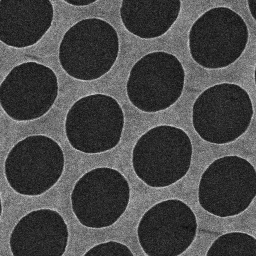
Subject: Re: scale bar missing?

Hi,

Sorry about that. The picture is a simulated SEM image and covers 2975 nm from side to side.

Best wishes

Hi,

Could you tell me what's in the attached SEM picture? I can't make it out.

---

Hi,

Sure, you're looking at a regular array of holes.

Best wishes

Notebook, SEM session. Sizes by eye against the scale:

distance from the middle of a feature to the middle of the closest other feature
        856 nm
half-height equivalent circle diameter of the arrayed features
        0.691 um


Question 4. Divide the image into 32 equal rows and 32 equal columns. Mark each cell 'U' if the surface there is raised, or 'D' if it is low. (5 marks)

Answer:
DDDDDDUUUDDUUUUDDDDDDDDUUUUUUUUD
DDDDDDDUUUUUUUUDDDDDDDUUUUDDDUUD
DDDDDDUUUUDDDUUDDDDDDDUUUDDDDDUU
DDDDDDUUUDDDDDUUDDDDDUUUDDDDDDDU
DDDDDUUUDDDDDDDUUDDDUUUUDDDDDDDU
UDDDUUUUDDDDDDDUUUUUUUUUDDDDDDDU
UUUUUUUDDDDDDDDUUUUUUUUUDDDDDDUU
UUUUUUUDDDDDDDUUUDDDDDUUDDDDDUUU
UUDDDDUUDDDDDDUUUDDDDDDUUUDUUUUU
UDDDDDDUUDDDDUUUDDDDDDDUUUUUUUUU
DDDDDDDUUUUUUUUUDDDDDDDUUUUUDUUU
DDDDDDDUUUUUUUUUDDDDDDDUUDDDDDDU
DDDDDDDUUUDDDDUUDDDDDDUUUDDDDDDU
DDDDDDUUUDDDDDDUUDDDDUUUDDDDDDDD
UDDDDUUUDDDDDDDUUUUUUUUUDDDDDDDU
UUUUUUUUDDDDDDDUUUUUUUUUDDDDDDDU
UUUUUUUUDDDDDDDUUUDDDDDUUDDDDDUU
UUUDDDDUUDDDDDDUUDDDDDDDUUDDDUUU
UUDDDDDDUDDDDDUUUDDDDDDDUUUUUUUU
UDDDDDDDUUUUUUUUUDDDDDDDUUUUUUUU
UDDDDDDDUUUUUUUUUDDDDDDDUUDDDDDU
UDDDDDDDUUUDDDDUUDDDDDDUUUDDDDDD
UDDDDDDUUUDDDDDDUUDDDDUUUDDDDDDD
UUDDDDUUUDDDDDDDUUUUUUUUUDDDDDDD
UUUUUUUUUDDDDDDDUUUUUUUUUDDDDDDD
UUUUUUUUUDDDDDDDUUUUDDDUUDDDDDDU
UUUUDDDUUDDDDDDUUUDDDDDDUUDDDDUU
UUUDDDDDUUDDDDDUUUDDDDDDUUUUUUUU
UUDDDDDDUUUUUUUUUDDDDDDDDUUUUUUU
UDDDDDDDUUUUUUUUUDDDDDDDUUUUDDDU
UDDDDDDDUUUUUDDUUUDDDDDDUUUDDDDD
UDDDDDDDUUUDDDDDUUDDDDDUUUDDDDDD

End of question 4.